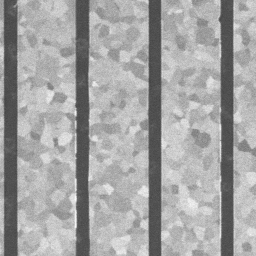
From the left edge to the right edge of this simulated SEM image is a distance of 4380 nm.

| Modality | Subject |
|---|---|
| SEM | one or a few lines or trenches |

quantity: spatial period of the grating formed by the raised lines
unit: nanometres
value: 1240